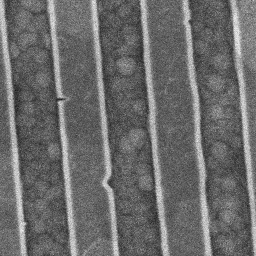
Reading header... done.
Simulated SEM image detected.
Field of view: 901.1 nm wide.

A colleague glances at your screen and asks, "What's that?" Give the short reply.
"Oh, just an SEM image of one or a few lines or trenches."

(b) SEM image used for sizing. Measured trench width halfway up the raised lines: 171 nanometers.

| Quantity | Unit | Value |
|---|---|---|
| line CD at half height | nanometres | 150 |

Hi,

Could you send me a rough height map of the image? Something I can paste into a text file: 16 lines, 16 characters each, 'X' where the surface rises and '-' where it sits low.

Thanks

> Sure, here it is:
---XXX---XXX---X
---XXX---XXX---X
---XXX---XXX---X
---XXX---XXX---X
X---XX---XXX---X
X---XX---XXX---X
X---XX---XXX---X
X---XX----XX---X
X---XXX---XX---X
X---XXX---XX---X
X---XXX---XXX---
X---XXX---XXX---
X---XXX---XXX---
X---XXX---XXX---
X----XX---XXX---
X----XX---XXX---